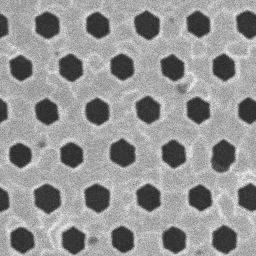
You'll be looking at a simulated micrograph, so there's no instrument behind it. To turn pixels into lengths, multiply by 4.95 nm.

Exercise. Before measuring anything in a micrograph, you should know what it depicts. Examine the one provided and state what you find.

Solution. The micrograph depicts a regular array of holes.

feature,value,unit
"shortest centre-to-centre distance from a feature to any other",0.242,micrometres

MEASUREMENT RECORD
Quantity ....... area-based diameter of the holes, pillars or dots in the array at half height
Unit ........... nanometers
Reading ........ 125